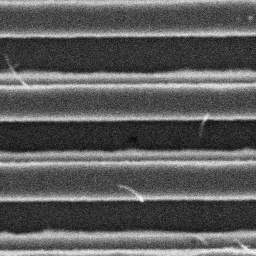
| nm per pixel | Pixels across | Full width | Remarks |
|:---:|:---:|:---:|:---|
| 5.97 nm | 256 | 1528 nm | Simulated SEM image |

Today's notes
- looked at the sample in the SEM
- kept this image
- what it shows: lines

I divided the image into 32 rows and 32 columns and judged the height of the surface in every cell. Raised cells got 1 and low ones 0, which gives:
11111111111111111111111111111111
11111111111111111111111111111111
11111111111111111111111111111111
11111111111111111111111111111111
11111111111111000000000000000000
00000000000000000000000000000000
00000000000000000000000000000000
00000000000000000000000000000000
00000000000000000000000000000000
01100000000000000001011111111111
11111111111111111111111111111111
11111111111111111111111111111111
11111111111111111111111111111111
11111111111111111111111111111111
11111111111111111111111111111111
00000000000000000000000000000000
00000000000000000000000000000000
00000000000000000000000000000000
00000000000000000000000000000000
11111111111111111111111111111111
11111111111111111111111111111111
11111111111111111111111111111111
11111111111111111111111111111111
11111111111111111111111111111111
11111111111111111111111111111111
00000000000000000000000000000000
00000000000000000000000000000000
00000000000000000000000000000000
00000000000000000000000000000000
00000110011001111111111111111111
11111111111111111111111111111111
11111111111111111111111111111111